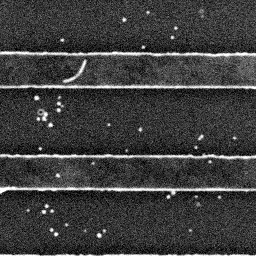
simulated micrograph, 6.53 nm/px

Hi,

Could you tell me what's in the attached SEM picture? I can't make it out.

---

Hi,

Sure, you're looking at lines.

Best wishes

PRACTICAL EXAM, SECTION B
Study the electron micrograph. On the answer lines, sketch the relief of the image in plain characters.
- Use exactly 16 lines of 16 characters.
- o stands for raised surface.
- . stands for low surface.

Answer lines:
................
................
................
oooooooooooooooo
oooooooooooooooo
...............o
................
................
................
................
oooooooooooooooo
oooooooooooooooo
................
................
................
................